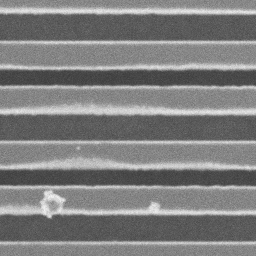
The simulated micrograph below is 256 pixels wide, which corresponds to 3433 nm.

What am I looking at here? lines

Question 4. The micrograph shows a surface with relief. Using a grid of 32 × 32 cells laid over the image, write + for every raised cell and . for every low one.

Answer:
++++++++++++++++++++++++++++++++
++++++++++++++++++++++++++++++++
................................
................................
................................
++++++++++++++++++++++++++++++++
++++++++++++++++++++++++++++++++
++++++++++++++++++++++++++++++++
++++++++++++++++++++++++++++++++
................................
................................
++++++++++++++++++++++++++++++++
++++++++++++++++++++++++++++++++
++++++++++++++++++++++++++++++++
................................
................................
................................
................................
++++++++++++++++++++++++++++++++
++++++++++++++++++++++++++++++++
++++++++++++++++++++++++++++++++
................................
................................
++++++++++++++++++++++++++++++++
++++++++++++++++++++++++++++++++
++++++++++++++++++++++++++++++++
++++++++++++++++++++++++++++++++
................................
................................
................................
++++++++++++++++++++++++++++++++
++++++++++++++++++++++++++++++++